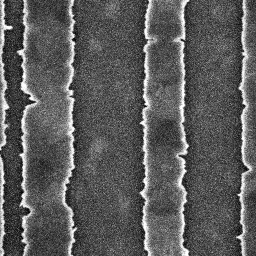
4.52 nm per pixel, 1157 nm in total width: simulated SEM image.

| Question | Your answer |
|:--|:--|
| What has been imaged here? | one or a few lines or trenches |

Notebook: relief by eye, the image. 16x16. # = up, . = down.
..###....###...#
..###....###...#
..###....##....#
.####....##....#
.####....###...#
..##.....###...#
..###....##....#
.####....##....#
.####....###...#
.####....###...#
.####....##....#
.###.....##....#
.###.....###...#
..###....##....#
.####....##....#
..##.....###...#